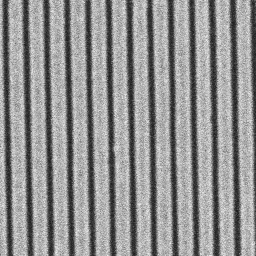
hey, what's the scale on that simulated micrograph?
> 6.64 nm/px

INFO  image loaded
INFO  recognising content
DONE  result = parallel lines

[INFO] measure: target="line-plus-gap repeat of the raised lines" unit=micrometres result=0.138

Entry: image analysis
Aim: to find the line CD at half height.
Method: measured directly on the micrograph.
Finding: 14.4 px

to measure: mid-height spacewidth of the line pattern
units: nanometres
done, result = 44.8